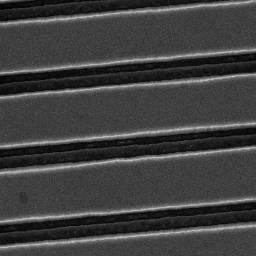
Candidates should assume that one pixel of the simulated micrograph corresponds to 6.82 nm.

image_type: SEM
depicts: lines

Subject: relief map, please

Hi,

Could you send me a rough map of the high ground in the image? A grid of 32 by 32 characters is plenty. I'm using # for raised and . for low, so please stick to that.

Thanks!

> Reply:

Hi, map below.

.........................#######
...............#################
....############################
################################
################################
################################
##############################..
####################............
#########.......................
............................####
..................##############
.....###########################
################################
################################
################################
################################
######################..........
###########.....................
#.............................##
....................############
.........#######################
################################
################################
################################
################################
############################....
################................
#####...........................
..........................######
..............##################
...#############################
################################